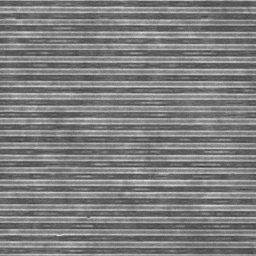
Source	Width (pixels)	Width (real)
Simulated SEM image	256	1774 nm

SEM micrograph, parallel lines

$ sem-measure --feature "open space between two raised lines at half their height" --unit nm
47.6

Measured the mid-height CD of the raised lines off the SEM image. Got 0.0355 µm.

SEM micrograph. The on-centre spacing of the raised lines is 85.6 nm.